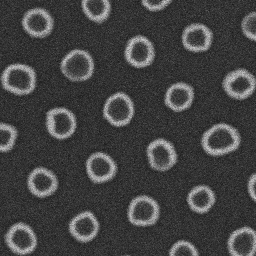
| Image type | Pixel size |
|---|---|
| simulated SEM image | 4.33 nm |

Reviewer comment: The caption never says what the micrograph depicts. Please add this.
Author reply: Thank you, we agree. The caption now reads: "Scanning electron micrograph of a regular array of raised bodies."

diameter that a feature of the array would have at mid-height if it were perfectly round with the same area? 130 nanometres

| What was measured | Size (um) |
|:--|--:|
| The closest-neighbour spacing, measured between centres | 0.257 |